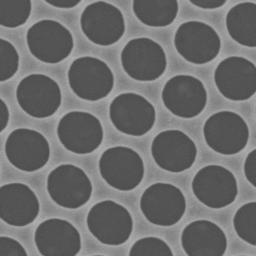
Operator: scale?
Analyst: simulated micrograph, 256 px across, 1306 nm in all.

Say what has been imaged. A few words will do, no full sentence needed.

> a regular array of holes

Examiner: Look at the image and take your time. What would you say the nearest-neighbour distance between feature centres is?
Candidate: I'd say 279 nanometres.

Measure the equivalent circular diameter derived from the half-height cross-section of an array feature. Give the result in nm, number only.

227